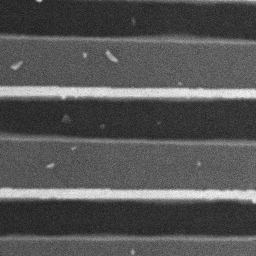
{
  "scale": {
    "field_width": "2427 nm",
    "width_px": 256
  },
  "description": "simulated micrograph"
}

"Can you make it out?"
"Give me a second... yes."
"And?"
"lines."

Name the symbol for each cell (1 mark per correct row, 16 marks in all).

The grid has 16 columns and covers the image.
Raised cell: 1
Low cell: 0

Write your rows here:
0000000000000000
0000000000000000
1111111111000000
1111111111111111
1111111111111111
1111111111111111
0000000000000000
0000000000000000
0000000000000000
1111111111111111
1111111111111111
1111111111111111
0000000000000000
0000000000000000
0000000000000000
1111111111111111